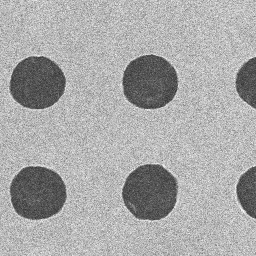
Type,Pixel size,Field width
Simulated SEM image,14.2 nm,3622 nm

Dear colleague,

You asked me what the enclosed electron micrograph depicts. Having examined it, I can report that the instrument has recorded holes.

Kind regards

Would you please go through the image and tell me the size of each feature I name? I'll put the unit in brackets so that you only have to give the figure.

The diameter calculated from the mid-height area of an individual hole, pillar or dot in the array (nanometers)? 786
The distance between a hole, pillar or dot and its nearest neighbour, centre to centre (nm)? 1560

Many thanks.